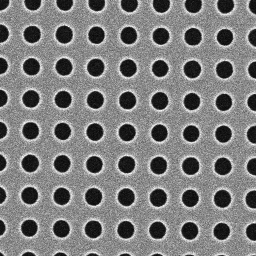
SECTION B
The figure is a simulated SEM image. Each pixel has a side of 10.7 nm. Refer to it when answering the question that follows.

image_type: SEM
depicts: a regular array of holes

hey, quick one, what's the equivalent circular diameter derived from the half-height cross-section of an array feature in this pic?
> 17.2 pixels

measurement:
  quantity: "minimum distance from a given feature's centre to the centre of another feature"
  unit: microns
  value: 0.342